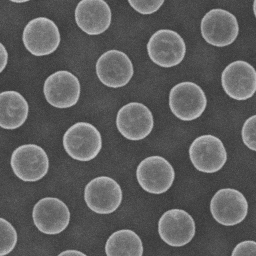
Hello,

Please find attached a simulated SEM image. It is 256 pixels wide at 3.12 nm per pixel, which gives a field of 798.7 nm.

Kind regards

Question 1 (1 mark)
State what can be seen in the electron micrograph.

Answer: a regular array of raised bodies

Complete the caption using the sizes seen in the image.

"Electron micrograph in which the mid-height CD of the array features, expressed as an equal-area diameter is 113 nanometres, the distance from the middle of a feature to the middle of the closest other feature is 0.175 microns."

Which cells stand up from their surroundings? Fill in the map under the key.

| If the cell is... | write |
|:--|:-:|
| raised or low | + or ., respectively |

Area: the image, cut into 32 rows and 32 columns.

..........+++...++++............
.........+++++...++.......++....
....++....++++...........++++...
...++++...+++............+++++..
...++++............+++...+++++..
...++++............++++....++...
+...++.......++....++++.........
+...........++++...++++.........
............+++++...........+++.
......+++...++++............++++
......++++...+++.......+....++++
.+....++++...........++++...++++
+++...++++...........+++++......
+++............+++...++++.......
+++............++++...+++.......
+++.......+....++++............+
........++++...++++...........++
........+++++............++...++
..+++...++++............++++...+
..++++...+++............++++....
..++++............+++...++++....
..++++...........+++++..........
...++.......++...+++++..........
...........++++...+++...........
...........++++............+++..
.....+++...++++...........+++++.
....+++++...++.......++...+++++.
....+++++...........++++...+++..
++...+++............++++........
++............+++...++++........
++...........+++++...++.......++
+.......++...+++++...........+++